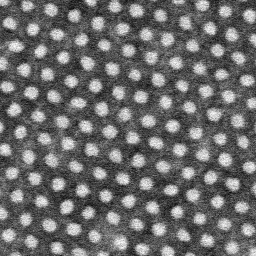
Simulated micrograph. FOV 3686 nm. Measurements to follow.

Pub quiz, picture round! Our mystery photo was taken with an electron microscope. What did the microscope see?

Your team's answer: a regular array of raised bodies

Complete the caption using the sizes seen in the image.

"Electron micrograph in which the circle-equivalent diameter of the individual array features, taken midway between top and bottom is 181 nm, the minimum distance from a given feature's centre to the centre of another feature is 332 nanometres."